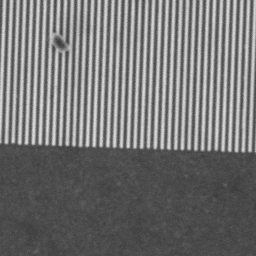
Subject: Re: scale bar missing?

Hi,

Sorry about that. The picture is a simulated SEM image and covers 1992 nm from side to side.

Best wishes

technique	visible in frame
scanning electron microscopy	parallel lines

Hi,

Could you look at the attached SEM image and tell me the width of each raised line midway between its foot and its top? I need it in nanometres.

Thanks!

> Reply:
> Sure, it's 22.4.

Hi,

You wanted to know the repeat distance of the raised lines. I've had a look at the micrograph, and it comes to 6.77 pixels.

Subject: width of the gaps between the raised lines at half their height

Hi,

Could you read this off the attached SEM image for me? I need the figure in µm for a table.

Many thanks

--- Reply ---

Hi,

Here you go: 0.0301